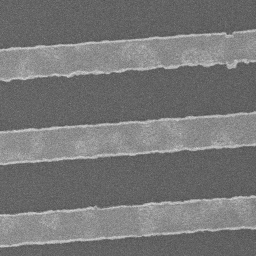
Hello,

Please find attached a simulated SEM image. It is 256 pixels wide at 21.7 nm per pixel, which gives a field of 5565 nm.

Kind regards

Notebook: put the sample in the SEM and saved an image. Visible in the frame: one or a few lines or trenches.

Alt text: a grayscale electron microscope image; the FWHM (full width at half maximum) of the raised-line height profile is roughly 658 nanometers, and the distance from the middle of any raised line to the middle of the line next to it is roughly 1.8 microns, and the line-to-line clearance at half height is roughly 1140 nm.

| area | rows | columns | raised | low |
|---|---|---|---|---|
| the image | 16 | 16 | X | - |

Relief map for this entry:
----------------
----------------
--------XXXXXXXX
XXXXXXXXXXXXXXXX
XXXXXXX---------
----------------
----------------
----------XXXXXX
XXXXXXXXXXXXXXXX
XXXXXXXXX-------
----------------
----------------
-------------XXX
XXXXXXXXXXXXXXXX
XXXXXXXXXXXX----
----------------